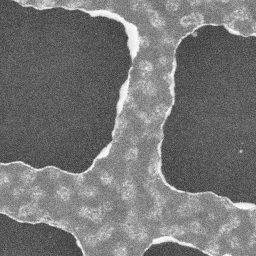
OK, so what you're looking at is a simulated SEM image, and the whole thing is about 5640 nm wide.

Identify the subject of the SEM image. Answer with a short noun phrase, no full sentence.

holes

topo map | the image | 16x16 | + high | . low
..+.++++++++++++
........++++++++
........+++.....
........+++.....
........+++.....
........+++.....
.......++++.....
.......+++......
.......+++......
......++++......
++....++++......
+++++++++++.....
++++++++++++++..
.+++++++++++++++
....++++++++++++
.....++++...++++